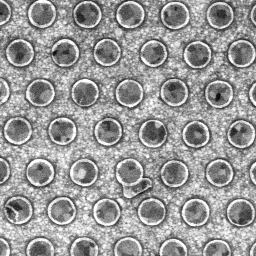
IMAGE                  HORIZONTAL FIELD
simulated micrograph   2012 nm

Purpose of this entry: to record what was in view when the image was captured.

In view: a regular array of raised bodies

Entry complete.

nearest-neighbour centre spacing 0.346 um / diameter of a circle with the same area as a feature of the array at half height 210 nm